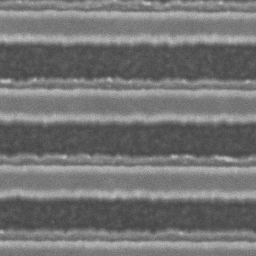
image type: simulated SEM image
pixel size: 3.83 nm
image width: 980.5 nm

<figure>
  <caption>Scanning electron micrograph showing lines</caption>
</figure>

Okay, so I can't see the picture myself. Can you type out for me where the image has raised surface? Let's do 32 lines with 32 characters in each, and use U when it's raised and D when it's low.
UUUUUUUUUUUUUUUUUUUUDUUUUUUUUUDU
UUUUUUUUUUUUUUUUUUUUUUUUUUUUUUUU
UUUUUUUUUUUUUUUUUUUUUUUUUUUUUUUU
UUUUUUUUUUUUUUUUUUUUUUUUUUUUUUUU
UUUUUUUUUUUUUUUUUUUUUUUUUUUUUUUU
DDDDDDDDDDDDDDDDDDDDDUDDDDDDDDDD
DDDDDDDDDDDDDDDDDDDDDDDDDDDDDDDD
DDDDDDDDDDDDDDDDDDDDDDDDDDDDDDDD
DDDDDDDDDDDDDDDDDDDDDDDDDDDDDDDD
DDDDDDDDDDDDDDDDDDDDDDDDDDDDDDDD
UUUUUUUUUUUUUUUUUUUUUUUUUUUUUUUU
UUUUUUUUUUUUUUUUUUUUUUUUUUUUUUUU
UUUUUUUUUUUUUUUUUUUUUUUUUUUUUUUU
UUUUUUUUUUUUUUUUUUUUUUUUUUUUUUUU
UUUUUUUUUUUUUUUUUUUUUUUUUUUUUUUU
DDDDDDDDDDDDDDDDDDDDDDDDDDDDDDDD
DDDDDDDDDDDDDDDDDDDDDDDDDDDDDDDD
DDDDDDDDDDDDDDDDDDDDDDDDDDDDDDDD
DDDDDDDDDDDDDDDDDDDDDDDDDDDDDDDD
DDDDDDUDDDUDDDDDDDDDDDDUDDDDDDDD
UUUUUUUUUUUUUUUUUUUUUUUUUUUUUUUU
UUUUUUUUUUUUUUUUUUUUUUUUUUUUUUUU
UUUUUUUUUUUUUUUUUUUUUUUUUUUUUUUU
UUUUUUUUUUUUUUUUUUUUUUUUUUUUUUUU
UUDUUUUUUUUUUUUUUUUUUUUUUUUUUUUU
DDDDDDDDDDDDDDDDDDDDDDDDDDDDDDDD
DDDDDDDDDDDDDDDDDDDDDDDDDDDDDDDD
DDDDDDDDDDDDDDDDDDDDDDDDDDDDDDDD
DDDDDDDDDDDDDDDDDDDDDDDDDDDDDDDD
UUUUUUUUUUUUUUUUUUUUUUUUUUUUUUUU
UUUUUUUUUUUUUUUUUUUUUUUUUUUUUUUU
UUUUUUUUUUUUUUUUUUUUUUUUUUUUUUUU